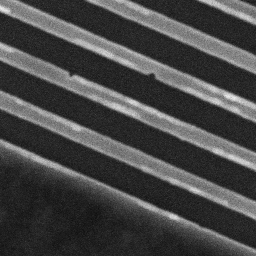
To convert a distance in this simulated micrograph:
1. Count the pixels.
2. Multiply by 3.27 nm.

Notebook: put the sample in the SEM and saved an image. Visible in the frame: parallel lines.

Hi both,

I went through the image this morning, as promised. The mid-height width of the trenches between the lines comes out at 28.7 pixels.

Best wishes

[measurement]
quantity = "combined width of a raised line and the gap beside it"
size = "0.146 micrometres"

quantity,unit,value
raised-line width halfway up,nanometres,51.3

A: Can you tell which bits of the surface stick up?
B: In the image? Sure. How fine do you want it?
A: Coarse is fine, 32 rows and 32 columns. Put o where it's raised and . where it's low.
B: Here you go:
ooo.........ooooo.........ooooo.
ooooo.........ooooo.........oooo
...oooo..........ooooo.........o
.....ooooo.........ooooo........
.......ooooo.........ooooo......
..........oooo..........oooo....
ooo.........ooooo.........ooooo.
ooooo.........ooooo.........oooo
..ooooo..........oooo.........oo
.....oooo..........ooooo........
.......ooooo.........ooooo......
.........ooooo.........ooooo....
ooo.........ooooo.........ooooo.
ooooo.........ooooo.........oooo
..ooooo.........ooooo.........oo
.....oooo.........ooooo.........
.......ooooo.........ooooo......
.........ooooo.........ooooo....
oo..........oooo..........oooo..
ooooo.........ooooo.........oooo
ooooooo.........ooooo.........oo
ooooooooo.........ooooo.........
oooooooooooo.........ooooo......
oooooooooooooo.........ooooo....
oooooooooooooooo.........ooooo..
ooooooooooooooooooo.........oooo
ooooooooooooooooooooo.........oo
ooooooooooooooooooooooo.........
ooooooooooooooooooooooooo.......
oooooooooooooooooooooooooooo....
oooooooooooooooooooooooooooooo..
oooooooooooooooooooooooooooooooo